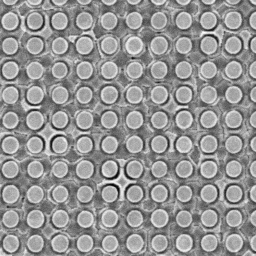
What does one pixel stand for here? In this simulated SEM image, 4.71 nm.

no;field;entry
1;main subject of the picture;a regular array of raised bodies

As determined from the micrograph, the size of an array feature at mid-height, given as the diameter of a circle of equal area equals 76.5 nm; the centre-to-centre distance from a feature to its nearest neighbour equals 114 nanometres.